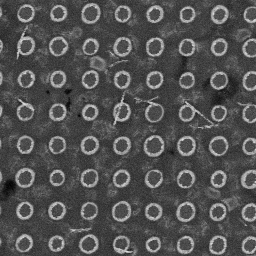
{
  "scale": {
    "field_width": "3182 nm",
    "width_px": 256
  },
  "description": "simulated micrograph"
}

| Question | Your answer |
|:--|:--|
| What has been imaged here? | a regular array of raised bodies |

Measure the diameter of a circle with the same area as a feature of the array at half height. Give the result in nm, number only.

206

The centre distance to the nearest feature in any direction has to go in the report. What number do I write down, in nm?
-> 398